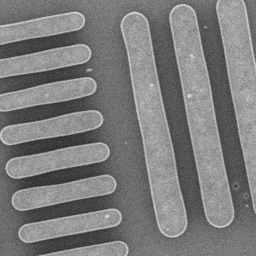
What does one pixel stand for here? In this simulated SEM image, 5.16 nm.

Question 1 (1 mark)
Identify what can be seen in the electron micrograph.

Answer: groups of lines, slits or small figures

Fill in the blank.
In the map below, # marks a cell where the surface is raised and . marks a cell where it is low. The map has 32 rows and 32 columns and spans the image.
...........................####.
.....................###...####.
....######.....###...####..####.
##########.....####..####...###.
######.........####...###...###.
................###...###...###.
.....######.....###...###...####
###########.....###...####..####
#######.........###...####..####
#...............####..####...###
......######.....###...###...###
..##########.....###...###...###
########.........###...####..###
###..............###...####..###
........#####....####..####...##
..###########....####...###...##
##########........###...###...##
####..............###...###...##
........#####.....####..####..##
....#########.....####..####..##
.##########.......####...###...#
.#####.............###...###...#
..........####.....###...###...#
....##########.....###...####..#
..##########.......####..####..#
..#####............####..####...
............###....####...###...
.......########.....###...###...
...##########.......###.........
..######.............#..........
.............###................
.......#########................